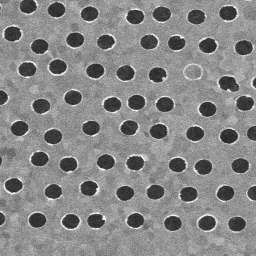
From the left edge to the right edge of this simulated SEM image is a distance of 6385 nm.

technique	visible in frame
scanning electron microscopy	a regular array of holes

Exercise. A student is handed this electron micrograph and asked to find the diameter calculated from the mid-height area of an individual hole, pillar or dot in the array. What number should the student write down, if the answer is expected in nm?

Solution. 415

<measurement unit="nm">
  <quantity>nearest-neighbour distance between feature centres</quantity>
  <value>740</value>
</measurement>